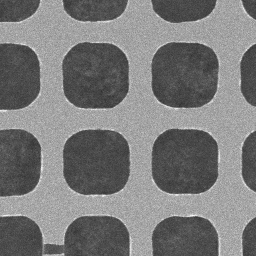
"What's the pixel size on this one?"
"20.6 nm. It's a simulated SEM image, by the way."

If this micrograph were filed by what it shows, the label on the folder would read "holes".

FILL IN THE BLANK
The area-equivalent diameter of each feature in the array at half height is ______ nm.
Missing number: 1450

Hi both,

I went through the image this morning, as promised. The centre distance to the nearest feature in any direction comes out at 1790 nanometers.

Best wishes